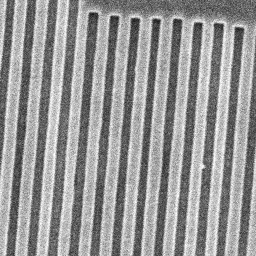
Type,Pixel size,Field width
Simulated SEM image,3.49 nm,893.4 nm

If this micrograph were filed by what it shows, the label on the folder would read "parallel lines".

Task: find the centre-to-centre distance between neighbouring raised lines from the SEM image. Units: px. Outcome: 21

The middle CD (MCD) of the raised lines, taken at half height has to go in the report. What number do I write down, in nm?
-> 37.4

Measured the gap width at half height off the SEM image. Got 34.3 nm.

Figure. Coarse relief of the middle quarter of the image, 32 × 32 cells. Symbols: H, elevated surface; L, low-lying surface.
LLLHHLLLHHLLLHHLLLHHHLLHHHLLLHHL
LLHHHLLLHHLLLHHLLLHHHLLHHHLLLHHL
LLHHHLLHHHLLLHHLLLHHHLLHHHLLLHHL
LLHHHLLHHHLLLHHLLLHHHLLHHHLLLHHL
LLHHHLLHHHLLLHHLLLHHHLLHHHLLHHHL
LLHHHLLHHHLLLHHLLLHHLLLHHHLLHHHL
LLHHHLLHHHLLHHHLLLHHLLLHHHLLHHHL
LLHHLLLHHHLLHHHLLLHHLLLHHHLLHHHL
LLHHLLLHHHLLHHHLLHHHLLLHHHLLHHHL
LLHHLLLHHHLLHHHLLHHHLLLHHLLLHHHL
LLHHLLLHHHLLHHHLLHHHLLHHHLLLHHLL
LLHHLLLHHLLLHHHLLHHHLLHHHLLLHHLL
LLHHLLLHHLLLHHHLLHHHLLHHHLLLHHLL
LHHHLLLHHLLLHHHLLHHHLLHHHLLLHHLL
LHHHLLHHHLLLHHHLLHHHLLHHHLLLHHLL
LHHHLLHHHLLLHHLLLHHHLLHHHLLLHHLL
LHHHLLHHHLLHHHLLLHHLLLHHHLLHHHLL
LHHHLLHHHLLHHHLLLHHLLLHHHLLHHHLL
LHHLLLHHHLLHHHLLLHHLLLHHHLLHHHLL
LHHLLLHHHLLHHHLLLHHLLLHHHLLHHHLL
LHHLLLHHHLLHHHLLHHHLLLHHHLLHHHLL
LHHLLLHHLLLHHHLLHHHLLHHHLLLHHHLL
LHHLLLHHLLLHHHLLHHHLLHHHLLLHHLLL
LHHLLLHHLLLHHHLLHHHLLHHHLLLHHLLL
LHHLLLHHLLLHHHLLHHHLLHHHLLLHHLLL
LHHLLLHHLLLHHHLLHHHLLHHHLLLHHLLL
LHHLLHHHLLLHHHLLHHHLLHHHLLHHHLLL
HHHLLHHHLLLHHLLLHHHLLHHHLLHHHLLL
HHLLLLHHLLHHHLLLHHLLLHHHLLHHHLLL
HHLLLHHHLLHHHLLLHHLLLHHHLLHHHLLL
HHLLLHHHLLHHHLLLHHLLLHHHLLHHHLLL
HHLLLHHHLLHHHLLLHHLLLHHHLLHHHLLL